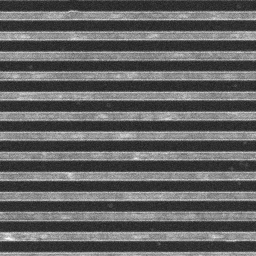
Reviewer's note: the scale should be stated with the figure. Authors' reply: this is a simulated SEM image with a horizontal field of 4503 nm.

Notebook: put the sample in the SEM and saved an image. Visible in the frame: parallel lines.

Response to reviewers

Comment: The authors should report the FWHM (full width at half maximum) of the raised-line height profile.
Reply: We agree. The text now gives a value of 12.9 px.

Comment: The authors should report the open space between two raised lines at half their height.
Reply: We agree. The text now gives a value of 0.119 um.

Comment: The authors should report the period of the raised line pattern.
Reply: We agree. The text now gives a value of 353 nanometers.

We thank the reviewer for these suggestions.